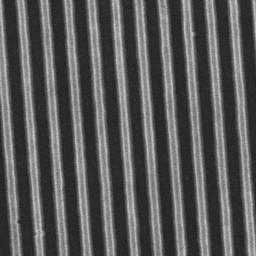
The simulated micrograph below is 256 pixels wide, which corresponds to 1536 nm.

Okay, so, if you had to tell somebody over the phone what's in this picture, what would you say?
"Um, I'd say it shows parallel lines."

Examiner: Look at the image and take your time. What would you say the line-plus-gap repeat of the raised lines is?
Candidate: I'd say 141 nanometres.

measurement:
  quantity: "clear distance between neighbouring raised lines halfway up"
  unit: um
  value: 0.0883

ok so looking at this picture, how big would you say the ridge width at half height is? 55.3 nm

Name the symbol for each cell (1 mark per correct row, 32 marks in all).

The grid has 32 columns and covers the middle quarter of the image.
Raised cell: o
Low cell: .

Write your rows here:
.oo....oo....oo....oo....oo....o
.oo....oo....oo....oo....oo....o
.oo....oo....oo....oo....oo....o
.ooo...oo....oo....oo....oo....o
.ooo...oo....ooo...oo....oo....o
..oo...ooo...ooo...oo....oo....o
..oo....oo....o....oo....oo....o
..oo....oo....oo...ooo...ooo...o
..oo....oo....oo...ooo...ooo...o
..oo....oo....oo....oo...ooo...o
..oo....oo....oo....oo...ooo...o
..oo....oo....oo....oo....oo....
..oo....oo....oo....oo....oo....
..oo....oo....oo....oo....oo....
..oo....oo....oo....oo....oo....
..oo....oo....oo....oo....oo....
..ooo...oo....oo....oo....oo....
...oo...oo....ooo...ooo...oo....
...oo...ooo...ooo...ooo...oo....
...oo....oo....oo...ooo...oo....
...oo....oo....oo...ooo...ooo...
...oo....oo....oo....oo...ooo...
...oo....oo....oo....oo...ooo...
...oo....oo....oo....oo....oo...
...oo....oo....oo....oo....oo...
...oo....oo....oo....oo....oo...
...oo....oo....oo....oo....oo...
...oo....oo....oo....oo....oo...
...oo....oo....oo....oo....oo...
...oo....oo....oo....oo....oo...
....o....oo....oo....oo....oo...
...ooo...ooo...oo....oo....oo...